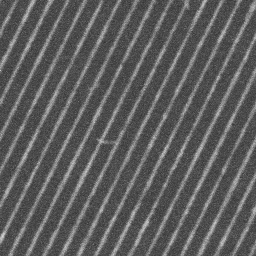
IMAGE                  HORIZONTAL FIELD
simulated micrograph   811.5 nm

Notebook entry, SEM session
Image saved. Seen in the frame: parallel lines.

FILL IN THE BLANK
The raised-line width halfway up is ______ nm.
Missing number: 7.1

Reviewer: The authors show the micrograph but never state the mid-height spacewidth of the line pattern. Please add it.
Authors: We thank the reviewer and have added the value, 41.2 nanometres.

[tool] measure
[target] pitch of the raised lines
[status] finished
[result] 0.0488 um